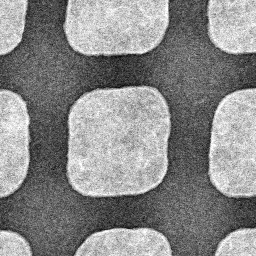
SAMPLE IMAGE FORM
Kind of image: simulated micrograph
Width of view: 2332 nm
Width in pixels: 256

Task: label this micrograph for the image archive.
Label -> raised bodies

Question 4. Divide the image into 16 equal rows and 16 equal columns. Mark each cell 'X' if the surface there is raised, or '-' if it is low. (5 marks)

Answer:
XX--XXXXXX---XXX
XX--XXXXXX---XXX
X---XXXXXX---XXX
----------------
----------------
--------X-------
X----XXXXX----XX
XX--XXXXXXX--XXX
XX--XXXXXXX--XXX
XX--XXXXXX---XXX
XX--XXXXXX---XXX
X----XXXXX---XXX
----------------
----------------
------XXXX-----X
XX---XXXXXX---XX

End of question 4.